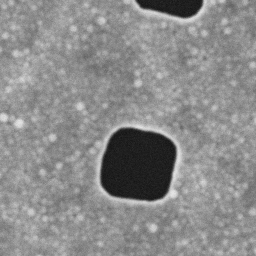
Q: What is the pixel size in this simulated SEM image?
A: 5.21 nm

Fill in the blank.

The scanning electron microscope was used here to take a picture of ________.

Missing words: holes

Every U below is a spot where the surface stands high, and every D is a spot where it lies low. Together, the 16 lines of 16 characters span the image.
UUUUUUUUUDDDDUUU
UUUUUUUUUUUUUUUU
UUUUUUUUUUUUUUUU
UUUUUUUUUUUUUUUU
UUUUUUUUUUUUUUUU
UUUUUUUUUUUUUUUU
UUUUUUUUUUUUUUUU
UUUUUUUUUUUUUUUU
UUUUUUUDDDUUUUUU
UUUUUUDDDDDUUUUU
UUUUUUDDDDDUUUUU
UUUUUUDDDDDUUUUU
UUUUUUUUDDUUUUUU
UUUUUUUUUUUUUUUU
UUUUUUUUUUUUUUUU
UUUUUUUUUUUUUUUU